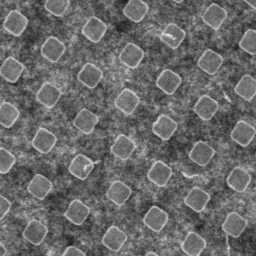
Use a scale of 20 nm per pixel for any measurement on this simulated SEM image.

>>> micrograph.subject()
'a regular array of raised bodies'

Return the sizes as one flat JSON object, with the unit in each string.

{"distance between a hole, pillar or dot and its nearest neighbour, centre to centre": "906 nm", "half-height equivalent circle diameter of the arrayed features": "0.457 um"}